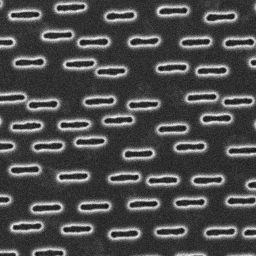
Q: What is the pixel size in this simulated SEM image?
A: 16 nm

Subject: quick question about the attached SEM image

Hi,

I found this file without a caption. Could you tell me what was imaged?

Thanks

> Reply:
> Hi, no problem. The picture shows a regular array of holes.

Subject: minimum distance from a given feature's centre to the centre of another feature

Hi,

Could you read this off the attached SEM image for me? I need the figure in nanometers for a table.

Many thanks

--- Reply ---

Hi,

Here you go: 460